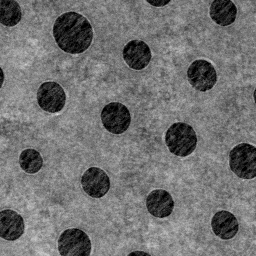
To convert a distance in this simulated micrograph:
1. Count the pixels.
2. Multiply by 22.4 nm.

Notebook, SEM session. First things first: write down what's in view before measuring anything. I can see a regular array of raised bodies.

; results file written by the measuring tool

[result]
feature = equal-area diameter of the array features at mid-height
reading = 29.5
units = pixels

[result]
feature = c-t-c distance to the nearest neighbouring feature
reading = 794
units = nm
